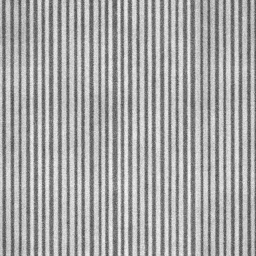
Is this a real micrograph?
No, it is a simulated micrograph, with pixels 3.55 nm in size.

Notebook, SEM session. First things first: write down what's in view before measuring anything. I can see parallel lines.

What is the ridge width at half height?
13.3 nm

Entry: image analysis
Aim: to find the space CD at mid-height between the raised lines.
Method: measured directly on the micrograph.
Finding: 12.9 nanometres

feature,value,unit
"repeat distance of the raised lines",7.89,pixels